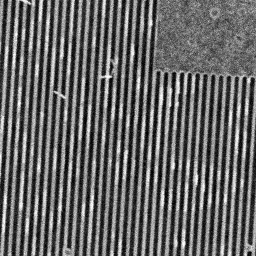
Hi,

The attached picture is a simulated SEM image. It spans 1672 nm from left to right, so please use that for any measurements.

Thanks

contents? parallel lines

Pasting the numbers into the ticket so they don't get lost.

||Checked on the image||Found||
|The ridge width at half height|19.5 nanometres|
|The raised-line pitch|51.2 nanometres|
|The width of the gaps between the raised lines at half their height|33.4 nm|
